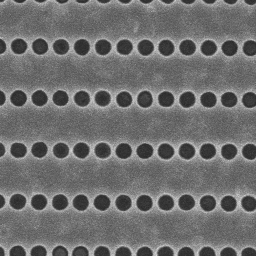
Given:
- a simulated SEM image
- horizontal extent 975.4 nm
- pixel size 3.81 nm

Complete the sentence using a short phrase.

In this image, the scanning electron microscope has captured a regular array of holes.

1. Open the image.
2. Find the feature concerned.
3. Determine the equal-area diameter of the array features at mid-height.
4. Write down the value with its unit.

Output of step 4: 62.2 nanometres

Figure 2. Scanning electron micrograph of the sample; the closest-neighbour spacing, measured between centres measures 79.5 nm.